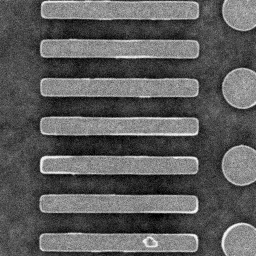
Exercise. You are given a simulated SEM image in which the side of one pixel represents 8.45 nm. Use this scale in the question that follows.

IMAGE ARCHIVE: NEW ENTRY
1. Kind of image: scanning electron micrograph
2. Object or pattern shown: groups of lines, slits or small figures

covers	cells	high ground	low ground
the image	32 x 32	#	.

.....####################...####
.....####################...####
............................####
.............................###
................................
.....####################.......
.....####################.......
................................
................................
............................####
.....####################...####
.....####################...####
............................####
................................
................................
.....####################.......
.....####################.......
................................
.............................##.
............................####
.....####################...####
.....###################....####
.............................###
................................
.....###########...###..........
.....####################.......
................................
................................
.............................###
.....###################....####
.....####################...####
............................####